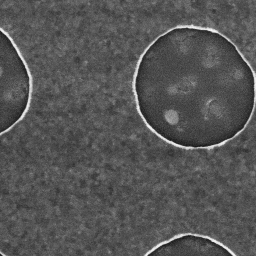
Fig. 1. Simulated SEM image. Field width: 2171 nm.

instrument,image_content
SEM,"holes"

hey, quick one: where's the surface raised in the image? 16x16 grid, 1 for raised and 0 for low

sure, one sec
1111111111111111
1111111111111111
0111111111000011
0111111110000001
0011111110000000
0011111100000000
0011111110000000
0111111110000000
1111111111000001
1111111111111111
1111111111111111
1111111111111111
1111111111111111
1111111111111111
1111111111111111
1111111111000011